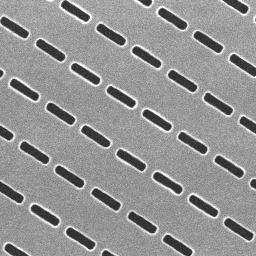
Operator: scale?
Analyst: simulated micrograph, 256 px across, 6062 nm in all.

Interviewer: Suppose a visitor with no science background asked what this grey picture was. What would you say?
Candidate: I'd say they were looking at a regular array of holes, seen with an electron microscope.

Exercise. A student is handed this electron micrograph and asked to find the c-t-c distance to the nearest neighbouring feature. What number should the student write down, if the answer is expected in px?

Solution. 42.6